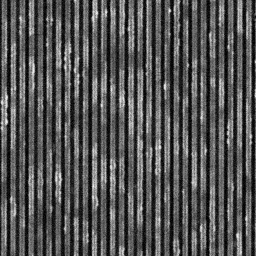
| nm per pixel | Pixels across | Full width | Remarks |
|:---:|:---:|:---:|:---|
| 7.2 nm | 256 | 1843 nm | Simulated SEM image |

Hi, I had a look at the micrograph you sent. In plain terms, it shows parallel lines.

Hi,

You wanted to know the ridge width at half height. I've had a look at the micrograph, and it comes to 34.2 nm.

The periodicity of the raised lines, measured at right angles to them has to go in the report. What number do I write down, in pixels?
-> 9.04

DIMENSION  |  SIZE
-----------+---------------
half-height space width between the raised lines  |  34.2 nanometers